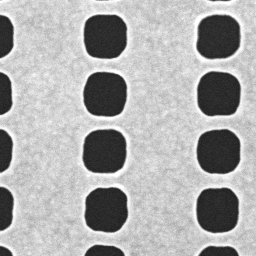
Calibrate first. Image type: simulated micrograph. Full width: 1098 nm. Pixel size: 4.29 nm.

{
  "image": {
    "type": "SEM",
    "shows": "a regular array of holes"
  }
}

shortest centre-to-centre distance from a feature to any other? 246 nm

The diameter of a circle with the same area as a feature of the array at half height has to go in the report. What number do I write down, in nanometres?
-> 200